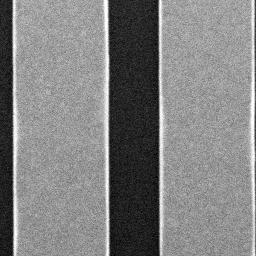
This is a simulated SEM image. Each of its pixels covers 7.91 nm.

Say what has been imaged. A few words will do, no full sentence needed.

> wiring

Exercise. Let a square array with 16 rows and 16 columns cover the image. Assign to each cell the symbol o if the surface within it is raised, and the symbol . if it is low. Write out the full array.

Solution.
.oooooo...oooooo
.oooooo...oooooo
.oooooo...oooooo
.oooooo...oooooo
.oooooo...oooooo
.oooooo...oooooo
.oooooo...oooooo
.oooooo...oooooo
.oooooo...oooooo
.oooooo...oooooo
.oooooo...oooooo
.oooooo...oooooo
.oooooo...oooooo
.oooooo...oooooo
.oooooo...oooooo
.oooooo...oooooo